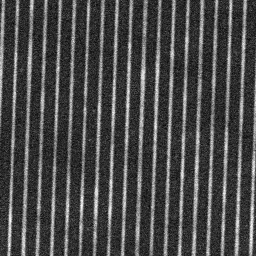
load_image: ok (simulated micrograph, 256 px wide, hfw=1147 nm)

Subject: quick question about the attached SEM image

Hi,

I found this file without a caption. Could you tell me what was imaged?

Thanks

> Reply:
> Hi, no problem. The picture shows parallel lines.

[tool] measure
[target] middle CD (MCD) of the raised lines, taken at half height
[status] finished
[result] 2.01 pixels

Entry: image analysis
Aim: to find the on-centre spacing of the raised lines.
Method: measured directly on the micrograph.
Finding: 14.2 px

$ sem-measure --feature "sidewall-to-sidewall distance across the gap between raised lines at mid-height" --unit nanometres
53.7